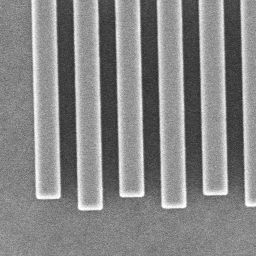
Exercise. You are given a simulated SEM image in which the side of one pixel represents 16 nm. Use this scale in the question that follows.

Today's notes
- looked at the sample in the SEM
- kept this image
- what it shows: groups of lines, slits or small figures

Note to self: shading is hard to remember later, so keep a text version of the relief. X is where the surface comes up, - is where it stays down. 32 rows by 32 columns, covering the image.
----XXX--XXX--XXX---XXX--XXX--XX
----XXX--XXX--XXX---XXX--XXX--XX
----XXX--XXX---XX---XXX--XXX--XX
----XXX--XXX---XX---XXX--XXX--XX
----XXX--XXX---XX---XXX--XXX--XX
----XXX--XXX---XX---XXX--XXX--XX
----XXX--XXX---XXX--XXX--XXX--XX
----XXX--XXX---XXX--XXX--XXX--XX
----XXX--XXX---XXX--XXX--XXX--XX
----XXX--XXX---XXX--XXX--XXX--XX
----XXX--XXX---XXX--XXX--XXX--XX
----XXX--XXX---XXX--XXX--XXX--XX
----XXX---XX---XXX--XXX--XXX--XX
----XXX---XX---XXX--XXX--XXX---X
----XXX---XX---XXX--XXX--XXX---X
----XXX---XX---XXX--XXX--XXX---X
----XXX---XX---XXX--XXX--XXX---X
----XXX---XXX--XXX--XXX--XXX---X
----XXX---XXX--XXX--XXX--XXX---X
----XXX---XXX--XXX--XXX--XXX---X
----XXX---XXX--XXX--XXX--XXX---X
----XXX---XXX--XXX--XXX--XXX---X
----XXX---XXX--XXX--XXX--XXX---X
-----XX---XXX--XXX--XXX--XXX---X
-----XX---XXX--XXX--XXX--------X
----------XXX-------XXX--------X
--------------------------------
--------------------------------
--------------------------------
--------------------------------
--------------------------------
--------------------------------